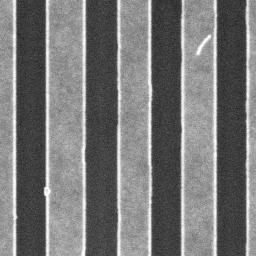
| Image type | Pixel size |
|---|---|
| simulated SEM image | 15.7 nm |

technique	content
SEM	lines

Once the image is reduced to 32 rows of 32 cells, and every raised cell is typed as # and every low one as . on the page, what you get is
##....#####....####....####....#
##....#####....####....####....#
##....#####....####....####....#
##....#####....####....####....#
##....#####....####....####....#
##....#####....####....####....#
##....#####....####....####....#
##....#####....####....####....#
##....#####....####....####....#
##....#####....####....####....#
##....#####....####....####....#
##....#####....####....####....#
##....#####....####....####....#
##....#####....####....####....#
##....#####....####....####....#
##....#####....####....####....#
##....#####....####....####....#
##....#####....####....####....#
##....#####....####....####....#
##....#####....####....####....#
##....#####....####....####....#
##....#####....####....####....#
##....#####....####....####....#
##....#####....####....####....#
##....#####....####....####....#
##....#####....####....####....#
##....#####....####....####....#
##....#####....####....####....#
##....#####....####....####....#
##....#####....####....####....#
##....#####....####....####....#
##....#####....####....####....#